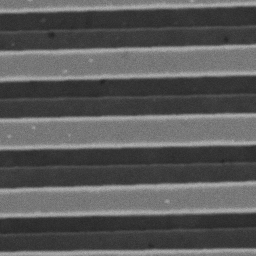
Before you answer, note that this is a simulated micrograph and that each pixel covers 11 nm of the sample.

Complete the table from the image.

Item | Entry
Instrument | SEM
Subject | lines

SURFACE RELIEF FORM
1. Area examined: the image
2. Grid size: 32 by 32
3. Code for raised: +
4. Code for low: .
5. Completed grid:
++++++++++++++++++++++++++++++++
++++............................
................................
................................
................................
................................
++++++++++++++++++++++++++++++++
++++++++++++++++++++++++++++++++
++++++++++++++++++++++++++++++++
+++++++++++++++++++++++++.......
................................
................................
................................
................................
..................++++++++++++++
++++++++++++++++++++++++++++++++
++++++++++++++++++++++++++++++++
++++++++++++++++++++++++++++++++
++++++++++......................
................................
................................
................................
................................
.....+++++++++++++++++++++++++++
++++++++++++++++++++++++++++++++
++++++++++++++++++++++++++++++++
+++++++++++++++++++++++++++++++.
................................
................................
................................
................................
..++++++++++++++++++++++++++++++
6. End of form